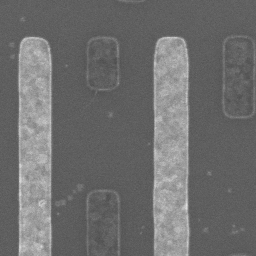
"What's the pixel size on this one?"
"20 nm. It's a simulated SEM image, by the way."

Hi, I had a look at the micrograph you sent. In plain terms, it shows wiring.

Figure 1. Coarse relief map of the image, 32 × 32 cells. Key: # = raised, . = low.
................................
................................
................................
................................
................................
...###.....####.....###.....####
..####.....####....####.....####
..####.....####....####.....####
..####.....####....####.....####
..####.....####....####.....####
..####.....####....####.....####
..####.............####.....####
..####.............####.....####
..####.............####.....####
..####.............####......##.
..####.............####.........
..####.............####.........
..####.............####.........
..####.............####.........
..####.............####.........
..####.............####.........
..####.............####.........
..####.............####.........
..####.............####.........
..####.....####....####.........
...###.....####....####.........
...###.....####....####.........
..####.....####....####.........
..####.....####....#####........
..####.....####....#####........
..####.....####....####.........
..####.....####....####.........